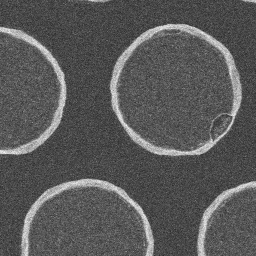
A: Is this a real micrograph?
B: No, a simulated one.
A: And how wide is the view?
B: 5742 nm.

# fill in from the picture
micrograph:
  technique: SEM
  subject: raised bodies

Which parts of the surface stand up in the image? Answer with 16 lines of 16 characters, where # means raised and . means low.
................
................
##.......####...
###.....######..
####...########.
####...########.
####...########.
###.....######..
###.....#####...
...........#....
................
.....#..........
...#####......##
..#######....###
..#######....###
..#######....###